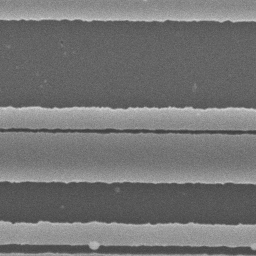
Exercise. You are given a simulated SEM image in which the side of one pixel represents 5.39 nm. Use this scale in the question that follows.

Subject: lines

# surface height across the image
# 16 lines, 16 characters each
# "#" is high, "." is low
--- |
################
................
................
................
................
................
................
################
################
################
################
................
................
................
################
################